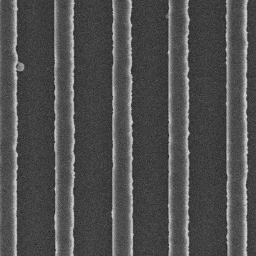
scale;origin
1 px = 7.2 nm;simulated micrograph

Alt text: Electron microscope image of lines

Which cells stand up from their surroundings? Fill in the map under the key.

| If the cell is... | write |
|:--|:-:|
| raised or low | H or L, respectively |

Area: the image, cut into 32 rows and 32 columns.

HHLLLLLHHLLLLLHHLLLLLHHHLLLLHHHL
HHLLLLLHHLLLLLHHLLLLLHHLLLLLHHHL
HHLLLLLHHLLLLLHHLLLLLHHHLLLLHHHL
HHLLLLLHHLLLLLHHLLLLLHHHLLLLHHHL
HHLLLLLHHLLLLLHHLLLLLHHLLLLLHHHL
HHLLLLLHHLLLLLHHLLLLLHHLLLLLHHHL
HHLLLLLHHLLLLLHHLLLLLHHHLLLLHHHL
HHLLLLLHHLLLLLHHLLLLLHHLLLLLHHHL
HHLLLLLHHLLLLLHHLLLLLHHHLLLLHHHL
HHLLLLLHHLLLLLHHLLLLLHHLLLLLHHHL
HHLLLLLHHLLLLLHHHLLLLHHHLLLLHHHL
HHLLLLLHHLLLLLHHLLLLLHHHLLLLHHHL
HHLLLLLHHLLLLLHHLLLLLHHHLLLLHHHL
HHLLLLLHHLLLLLHHLLLLLHHHLLLLHHHL
HHLLLLLHHLLLLLHHLLLLLHHHLLLLHHHL
HHLLLLLHHLLLLLHHHLLLLHHHLLLLHHHL
HHLLLLLHHLLLLLHHLLLLLHHHLLLLHHHL
HHLLLLLHHLLLLLHHHLLLLHHLLLLLHHHL
HHLLLLLHHLLLLLHHHLLLLHHHLLLLHHHL
HHLLLLLHHLLLLLHHHLLLLHHHLLLLHHHL
HHLLLLLHHLLLLLHHLLLLLHHHLLLLHHHL
HHLLLLLHHLLLLLHHLLLLLHHHLLLLHHHL
HHLLLLLHHLLLLLHHHLLLLHHHLLLLHHHL
HHLLLLLHHLLLLLHHHLLLLHHHLLLLHHHL
HHLLLLLHHLLLLLHHHLLLLHHHLLLLHHHL
HHLLLLLHHLLLLLHHHLLLLHHHLLLLHHHL
HHLLLLLHHLLLLLHHHLLLLHHLLLLLHHHL
HHLLLLLHHLLLLLHHHLLLLHHHLLLLHHHL
HHLLLLLHHLLLLLHHHLLLLHHLLLLLLHHL
HHLLLLLHHLLLLLHHHLLLLHHLLLLLHHHL
HHLLLLLHHLLLLLHHHLLLLHHHLLLLHHHL
HHLLLLLHHLLLLLHHHLLLLHHHLLLLLHHL